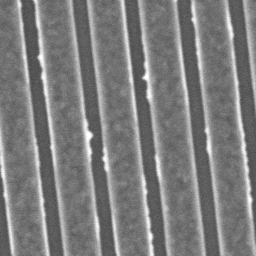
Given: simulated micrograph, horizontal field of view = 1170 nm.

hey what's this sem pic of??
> parallel lines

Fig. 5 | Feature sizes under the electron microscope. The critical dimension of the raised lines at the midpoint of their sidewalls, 170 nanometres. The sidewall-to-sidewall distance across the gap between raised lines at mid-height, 0.0669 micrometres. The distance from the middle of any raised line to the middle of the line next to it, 0.237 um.